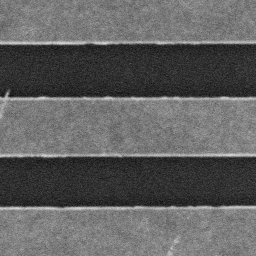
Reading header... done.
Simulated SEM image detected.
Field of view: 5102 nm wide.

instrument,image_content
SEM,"lines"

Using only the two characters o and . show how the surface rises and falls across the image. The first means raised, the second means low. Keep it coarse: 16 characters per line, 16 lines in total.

oooooooooooooooo
oooooooooooooooo
oooooooooooooooo
................
................
................
oooooooooooooooo
oooooooooooooooo
oooooooooooooooo
oooooooooooooooo
................
................
................
oooooooooooooooo
oooooooooooooooo
oooooooooooooooo